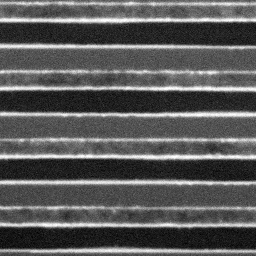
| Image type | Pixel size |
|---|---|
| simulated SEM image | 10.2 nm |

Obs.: lines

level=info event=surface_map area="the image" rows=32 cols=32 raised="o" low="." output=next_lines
oooooooooooooooooooooooooooooooo
oooooooooooooooooooooooooooooooo
...............oo.....oo..oooooo
................................
................................
................................
oooooooooooooooooooooooooooooooo
oooooooooooooooooooooooooooooooo
oooooooooooooooooooooooooooooooo
oooooooooooooooooooooooooooooooo
oooooooooooooooooooooooooooooooo
................................
................................
................................
ooooooooooooooooooo.oooooooooooo
oooooooooooooooooooooooooooooooo
oooooooooooooooooooooooooooooooo
oooooooooooooooooooooooooooooooo
oooooooooooooooooooooooooooooooo
oooooooooooooooooooooooooooooooo
................................
................................
................................
oooooooooooooooooooooooooooooooo
oooooooooooooooooooooooooooooooo
oooooooooooooooooooooooooooooooo
oooooooooooooooooooooooooooooooo
oooooooooooooooooooooooooooooooo
................................
................................
................................
ooooooooooooooooo.o..o..........